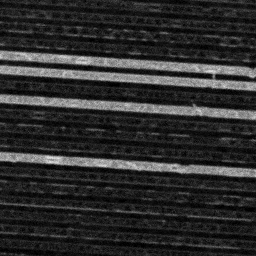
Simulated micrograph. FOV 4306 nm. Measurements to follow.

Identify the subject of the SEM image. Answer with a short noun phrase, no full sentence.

parallel lines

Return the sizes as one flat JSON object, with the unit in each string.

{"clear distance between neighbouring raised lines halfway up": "113 nm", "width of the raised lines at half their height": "0.124 microns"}